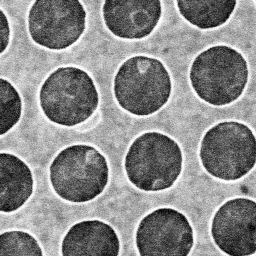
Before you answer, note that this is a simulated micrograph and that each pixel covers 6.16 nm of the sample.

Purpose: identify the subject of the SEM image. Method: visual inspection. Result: holes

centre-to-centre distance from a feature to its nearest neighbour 464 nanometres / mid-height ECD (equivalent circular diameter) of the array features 365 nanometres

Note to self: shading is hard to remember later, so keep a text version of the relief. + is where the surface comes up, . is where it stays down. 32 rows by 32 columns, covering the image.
++++......+++.......++.......+++
++++.......++.......++.......+++
.++........++.......+++.....++++
.+++.......++......++++++.++++++
.+++......+++++...++++++++++++++
.++++....+++++++++++++++++++++++
+++++++++++++++++++++++++.....++
++++++++++++++++....++++.......+
+++++++...+++++......+++.......+
++++++.....+++.......+++.......+
.++++.......++.......+++.......+
..+++.......++.......+++......++
...++.......+++......++++....+++
...++.......+++.....++++++++++++
...+++.....+++++++++++++++++++++
..+++++...+++++++++++++++++...++
.++++++++++++++++++.++++++......
+++++++++++++++++.....+++.......
++++++++....++++......+++.......
..+++++......+++.......++.......
...+++.......+++.......++.......
....++........++.......+++.....+
....++........++......++++++.+++
....+++......++++....+++++++++++
....+++.....++++++++++++++++++++
...+++++++++++++++++++++++++....
.++++++++++++++++++...+++++.....
++++++++++++++++++.....++++.....
+++++++++.....+++.......++......
....++++.......++.......++......
.....+++.......++.......+++.....
.....+++.......++.......++++....